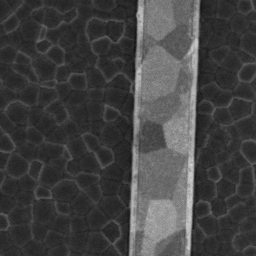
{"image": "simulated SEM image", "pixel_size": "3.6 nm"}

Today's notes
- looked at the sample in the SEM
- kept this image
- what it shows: one or a few lines or trenches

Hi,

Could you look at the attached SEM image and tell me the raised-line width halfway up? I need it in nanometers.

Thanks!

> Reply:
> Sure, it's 209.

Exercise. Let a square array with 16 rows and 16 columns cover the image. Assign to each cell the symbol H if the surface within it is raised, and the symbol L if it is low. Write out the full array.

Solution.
LLLLLLLLLHHHLLLL
LLLLLLLLLHHHLLLL
LLLLLLLLLHHHLLLL
LLLLLLLLLHHHLLLL
LLLLLLLLLHHHLLLL
LLLLLLLLLHHHLLLL
LLLLLLLLLHHHLLLL
LLLLLLLLHHHHLLLL
LLLLLLLLHHHHLLLL
LLLLLLLLHHHHLLLL
LLLLLLLLHHHHLLLL
LLLLLLLLHHHHLLLL
LLLLLLLLHHHHLLLL
LLLLLLLLHHHHLLLL
LLLLLLLLHHHHLLLL
LLLLLLLLHHHHLLLL